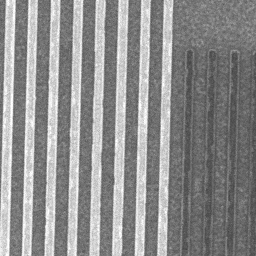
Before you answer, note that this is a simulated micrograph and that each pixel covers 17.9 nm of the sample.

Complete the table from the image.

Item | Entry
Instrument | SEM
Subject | parallel lines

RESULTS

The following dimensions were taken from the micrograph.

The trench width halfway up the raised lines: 262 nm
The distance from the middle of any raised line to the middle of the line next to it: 405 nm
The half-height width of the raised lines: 0.13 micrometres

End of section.